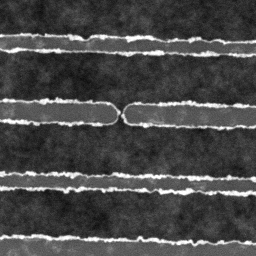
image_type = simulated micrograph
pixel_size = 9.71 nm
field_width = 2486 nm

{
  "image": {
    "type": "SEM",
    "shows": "one or a few lines or trenches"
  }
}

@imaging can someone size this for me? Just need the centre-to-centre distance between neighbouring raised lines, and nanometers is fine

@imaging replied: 667